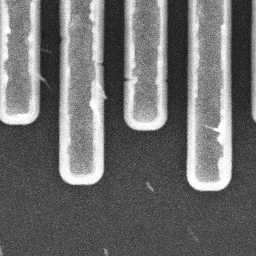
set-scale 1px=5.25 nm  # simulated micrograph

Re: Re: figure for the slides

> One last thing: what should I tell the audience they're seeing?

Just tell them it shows parallel lines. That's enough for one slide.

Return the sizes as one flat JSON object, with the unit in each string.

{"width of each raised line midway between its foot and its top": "197 nanometres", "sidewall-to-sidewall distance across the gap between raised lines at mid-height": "136 nm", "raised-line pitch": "336 nanometres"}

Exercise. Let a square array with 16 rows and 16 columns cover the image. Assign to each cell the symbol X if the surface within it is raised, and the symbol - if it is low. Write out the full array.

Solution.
XX--XX--XX--XX--
XX--XX--XX--XX--
XX--XX--XX--XX--
XX--XX--XX--XX--
XX--XX--XX--XX--
XX--XX--XX--XX--
XX--XX--XX--XX--
XX--XX--XX--XX--
----XX------XX--
----XX------XX--
----XX------XX--
------------XX--
----------------
----------------
----------------
----------------